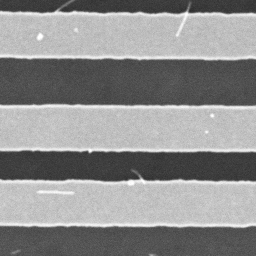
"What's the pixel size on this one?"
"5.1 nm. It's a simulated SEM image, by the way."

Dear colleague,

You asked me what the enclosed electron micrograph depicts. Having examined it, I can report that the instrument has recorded lines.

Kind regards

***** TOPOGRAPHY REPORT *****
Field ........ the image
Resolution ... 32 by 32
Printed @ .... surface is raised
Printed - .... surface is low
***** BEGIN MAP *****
--------------------------------
@------@-@----------------------
@@@@@@@@@@@@@@@@@@@@@@@@@@@@@@@@
@@@@@@@@@@@@@@@@@@@@@@@@@@@@@@@@
@@@@@@@@@@@@@@@@@@@@@@@@@@@@@@@@
@@@@@@@@@@@@@@@@@@@@@@@@@@@@@@@@
@@@@@@@@@@@@@@@@@@@@@@@@@@@@@@@@
--------------------------------
--------------------------------
--------------------------------
--------------------------------
--------------------------------
--------------------------------
@@@@@@@@@@@@@@@@@@@@@@@@@@@@@@@@
@@@@@@@@@@@@@@@@@@@@@@@@@@@@@@@@
@@@@@@@@@@@@@@@@@@@@@@@@@@@@@@@@
@@@@@@@@@@@@@@@@@@@@@@@@@@@@@@@@
@@@@@@@@@@@@@@@@@@@@@@@@@@@@@@@@
@@@@@@@@@@@@@@@@@@@@@@@@@@@@@@@@
--------------------------------
--------------------------------
--------------------------------
---------@-------@----@---------
@@@@@@@@@@@@@@@@@@@@@@@@@@@@@@@@
@@@@@@@@@@@@@@@@@@@@@@@@@@@@@@@@
@@@@@@@@@@@@@@@@@@@@@@@@@@@@@@@@
@@@@@@@@@@@@@@@@@@@@@@@@@@@@@@@@
@@@@@@@@@@@@@@@@@@@@@@@@@@@@@@@@
--------------------------------
--------------------------------
--------------------------------
--------------------------------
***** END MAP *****